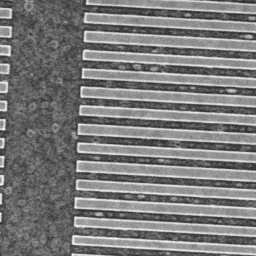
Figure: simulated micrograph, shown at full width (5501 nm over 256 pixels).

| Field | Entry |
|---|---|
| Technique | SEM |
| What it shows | parallel lines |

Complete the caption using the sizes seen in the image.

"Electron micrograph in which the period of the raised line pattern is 0.399 micrometres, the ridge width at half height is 198 nm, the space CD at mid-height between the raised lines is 9.24 pixels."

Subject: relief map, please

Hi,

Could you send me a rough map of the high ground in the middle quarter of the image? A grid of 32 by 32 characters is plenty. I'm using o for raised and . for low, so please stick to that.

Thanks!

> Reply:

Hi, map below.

..................o.............
.....oo.........................
.....ooooooooooooooooooo........
.........ooooooooooooooooooooooo
..........................oooooo
................................
....ooooooooooooo...............
....oooooooooooooooooooooooooooo
...........ooooooooooooooooooooo
.............................ooo
................................
....oooooooooooooooo............
....oooooooooooooooooooooooooooo
..................oooooooooooooo
................................
....ooooo.......................
....oooooooooooooooooooooo......
.......ooooooooooooooooooooooooo
.....................o..oooooooo
................................
....ooooooooooo.................
....oooooooooooooooooooooooooooo
.............ooooooooooooooooooo
...............................o
................................
...ooooooooooooooooooo..........
...ooooooooooooooooooooooooooooo
................oooooooooooooooo
................................
...oooooooo.....................
...ooooooooooooooooooooooooo....
.........ooooooooooooooooooooooo